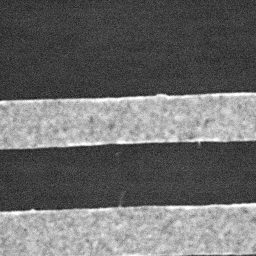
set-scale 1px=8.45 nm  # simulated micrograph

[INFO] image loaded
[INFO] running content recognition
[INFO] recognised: one or a few lines or trenches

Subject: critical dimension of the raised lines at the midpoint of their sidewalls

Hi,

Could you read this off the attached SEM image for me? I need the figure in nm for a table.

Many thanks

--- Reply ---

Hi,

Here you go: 394